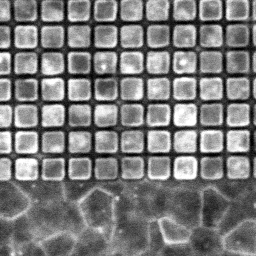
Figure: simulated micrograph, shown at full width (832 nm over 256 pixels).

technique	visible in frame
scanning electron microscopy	a regular array of raised bodies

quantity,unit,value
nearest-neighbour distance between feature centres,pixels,26.1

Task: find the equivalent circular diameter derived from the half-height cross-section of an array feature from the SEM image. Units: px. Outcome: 23.2